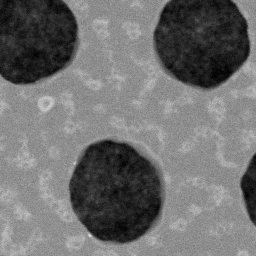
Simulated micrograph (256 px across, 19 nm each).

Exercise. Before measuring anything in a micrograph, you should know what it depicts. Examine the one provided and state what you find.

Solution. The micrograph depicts holes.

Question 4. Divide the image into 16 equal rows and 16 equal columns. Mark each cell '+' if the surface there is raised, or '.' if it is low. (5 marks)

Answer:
....++++++.....+
.....+++++.....+
.....+++++......
.....+++++......
....++++++.....+
++++++++++++.+++
++++++++++++++++
++++++++++++++++
++++++++++++++++
+++++....+++++++
+++++.....+++++.
++++......+++++.
++++......+++++.
+++++.....++++++
++++++...+++++++
++++++++++++++++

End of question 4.